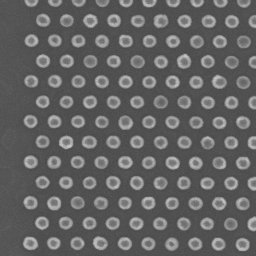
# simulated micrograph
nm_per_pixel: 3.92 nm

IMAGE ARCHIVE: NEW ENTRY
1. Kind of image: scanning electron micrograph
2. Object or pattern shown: a regular array of raised bodies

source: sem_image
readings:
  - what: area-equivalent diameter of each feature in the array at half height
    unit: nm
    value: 48.9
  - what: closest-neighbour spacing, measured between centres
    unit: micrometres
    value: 0.0901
